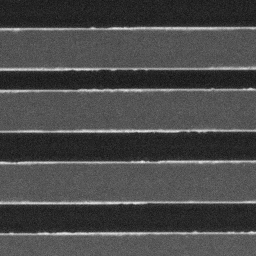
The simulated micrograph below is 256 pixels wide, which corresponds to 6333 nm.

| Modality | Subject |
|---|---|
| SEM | lines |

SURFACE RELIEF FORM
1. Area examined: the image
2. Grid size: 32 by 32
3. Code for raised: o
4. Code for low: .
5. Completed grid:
................................
................................
................................
................................
oooooooooooooooooooooooooooooooo
oooooooooooooooooooooooooooooooo
oooooooooooooooooooooooooooooooo
oooooooooooooooooooooooooooooooo
oooooooooooooooooooooooooooooooo
................................
................................
oooooooooooooooooooooooooooooooo
oooooooooooooooooooooooooooooooo
oooooooooooooooooooooooooooooooo
oooooooooooooooooooooooooooooooo
oooooooooooooooooooooooooooooooo
................................
................................
................................
................................
oooooooooooooooooooooooooooooooo
oooooooooooooooooooooooooooooooo
oooooooooooooooooooooooooooooooo
oooooooooooooooooooooooooooooooo
oooooooooooooooooooooooooooooooo
................................
................................
................................
................................
oooooooooooooooooooooooooooooooo
oooooooooooooooooooooooooooooooo
oooooooooooooooooooooooooooooooo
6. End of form